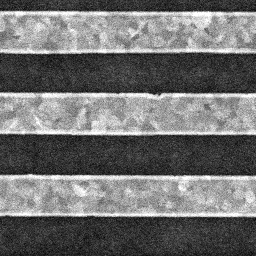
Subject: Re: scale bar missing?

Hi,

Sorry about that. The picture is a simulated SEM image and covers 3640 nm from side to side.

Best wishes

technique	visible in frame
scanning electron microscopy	one or a few lines or trenches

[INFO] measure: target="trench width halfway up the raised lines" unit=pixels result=43.6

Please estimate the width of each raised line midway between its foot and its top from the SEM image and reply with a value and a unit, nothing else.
0.537 microns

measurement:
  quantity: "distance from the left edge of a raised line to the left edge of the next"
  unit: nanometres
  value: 1160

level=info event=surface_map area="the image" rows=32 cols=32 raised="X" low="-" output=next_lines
--------------------------------
--------------------------------
XXXXXXXXXXXXXXXXXXXXXXXXXXXXXXXX
XXXXXXXXXXXXXXXXXXXXXXXXXXXXXXXX
XXXXXXXXXXXXXXXXXXXXXXXXXXXXXXXX
XXXXXXXXXXXXXXXXXXXXXXXXXXXXXXXX
--------------------------------
--------------------------------
--------------------------------
--------------------------------
--------------------------------
--------------------------------
XXXXXXXXXXXXXXXXXXXXXXXXXXXXXXXX
XXXXXXXXXXXXXXXXXXXXXXXXXXXXXXXX
XXXXXXXXXXXXXXXXXXXXXXXXXXXXXXXX
XXXXXXXXXXXXXXXXXXXXXXXXXXXXXXXX
--------XXXXXXXXXXXXXXXXXXXXXXXX
--------------------------------
--------------------------------
--------------------------------
--------------------------------
--------------------------------
XXXXXXXXXXXXXXXXXXXXXXXXXXXXXXXX
XXXXXXXXXXXXXXXXXXXXXXXXXXXXXXXX
XXXXXXXXXXXXXXXXXXXXXXXXXXXXXXXX
XXXXXXXXXXXXXXXXXXXXXXXXXXXXXXXX
XXXXXXXXXXXXXXXXXXXXXXXXXXXXXXXX
--------------------------------
--------------------------------
--------------------------------
--------------------------------
--------------------------------